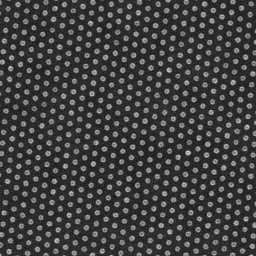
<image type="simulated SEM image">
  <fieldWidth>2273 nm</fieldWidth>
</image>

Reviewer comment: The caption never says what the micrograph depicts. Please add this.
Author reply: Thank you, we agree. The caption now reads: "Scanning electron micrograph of a regular array of raised bodies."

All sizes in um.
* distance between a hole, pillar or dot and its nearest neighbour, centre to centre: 0.093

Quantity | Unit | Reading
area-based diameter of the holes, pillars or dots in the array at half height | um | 0.0401